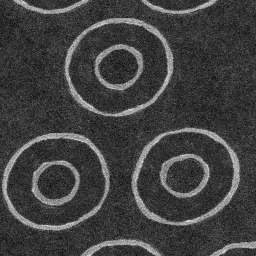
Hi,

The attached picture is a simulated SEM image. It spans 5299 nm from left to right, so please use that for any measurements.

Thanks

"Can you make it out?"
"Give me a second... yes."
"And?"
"ring-shaped raised bodies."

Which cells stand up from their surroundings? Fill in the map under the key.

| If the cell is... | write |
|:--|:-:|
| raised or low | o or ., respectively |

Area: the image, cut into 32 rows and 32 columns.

...ooooooo........oooooooo......
.....................oo.........
................................
...........oooooooo.............
..........oooooooooo............
.........oooooooooooo...........
.........oooo....oooo...........
........oooo.....oooo...........
........oooo......ooo...........
........oooo.....oooo...........
.........oooo...ooooo...........
.........ooooooooooo............
..........ooooooooo.............
...........ooooooo..............
................................
................................
......................ooo.......
....ooooooo.........oooooooo....
...ooooooooo......ooooooooooo...
..oooooooooo......ooooooooooo...
.ooooo..ooooo....oooo....ooooo..
.oooo....oooo....ooo......oooo..
.ooo......ooo....ooo......oooo..
oooo......ooo....oooo....oooo...
.oooo....oooo....oooooooooooo...
.oooooooooooo.....oooooooooo....
..oooooooooo......ooooooooo.....
...ooooooo..........ooooo.......
................................
................................
..............oooo..............
...........oooooooo........ooooo